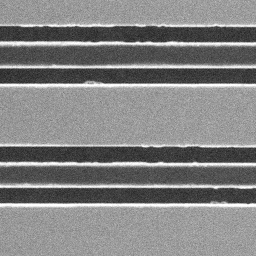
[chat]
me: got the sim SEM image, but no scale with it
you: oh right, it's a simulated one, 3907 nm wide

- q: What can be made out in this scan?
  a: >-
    lines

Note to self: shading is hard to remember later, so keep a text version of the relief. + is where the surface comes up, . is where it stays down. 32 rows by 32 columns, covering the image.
++++++++++++++++++++++++++++++++
++++++++++++++++++++++++++++++++
++++++++++++++++++++++++++++++++
................................
................................
++++++++++++++++++++++++++++++.+
++++++++++++++++++++++++++++++++
++++++++++++++++++++++++++++++++
................................
................................
................................
++++++++++++++++++++++++++++++++
++++++++++++++++++++++++++++++++
++++++++++++++++++++++++++++++++
++++++++++++++++++++++++++++++++
++++++++++++++++++++++++++++++++
++++++++++++++++++++++++++++++++
++++++++++++++++++++++++++++++++
................................
................................
++++++++++++++++++++++++++++++++
++++++++++++++++++++++++++++++++
++++++++++++++++++++++++++++++++
................................
................................
................................
++++++++++++++++++++++++++++++++
++++++++++++++++++++++++++++++++
++++++++++++++++++++++++++++++++
++++++++++++++++++++++++++++++++
++++++++++++++++++++++++++++++++
++++++++++++++++++++++++++++++++